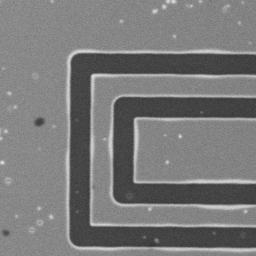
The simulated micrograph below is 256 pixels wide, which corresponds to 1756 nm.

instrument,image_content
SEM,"groups of lines, slits or small figures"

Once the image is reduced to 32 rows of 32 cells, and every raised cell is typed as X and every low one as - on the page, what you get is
XXXXXXXXXXXXXXXXXXXXXXXXXXXXXXXX
XXXXXXXXXXXXXXXXXXXXXXXXXXXXXXXX
XXXXXXXXXXXXXXXXXXXXXXXXXXXXXXXX
XXXXXXXXXXXXXXXXXXXXXXXXXXXXXXXX
XXXXXXXXXXXXXXXXXXXXXXXXXXXXXXXX
XXXXXXXXXXXXXXXXXXXXXXXXXXXXXXXX
XXXXXXXXXX-XXXXXXXXXXXXXXXXXXXXX
XXXXXXXXX-----------------------
XXXXXXXXX-----------------------
XXXXXXXXX---XXXXXXXXXXXXXX-XXXXX
XXXXXXXXX---XXXXXXXXXXXXXXXXXXXX
XXXXXXXXX---XXXXXXXXXXXXXXXXXXXX
XXXXXXXXX---XXX-----------------
XXXXXXXXX--XXX------------------
XXXXXXXXX--XXX------------------
XXXXXXXXX--XXX---XXXXXXXXXXXXXXX
XXXXXXXXX--XXX---XXXXXXXXXXXXXXX
XXXXXXXXX--XXX---XXXXXXXXXXXXXXX
XXXXXXXXX--XXX---XXXXXXXXXXXXXXX
XXXXXXXXX--XXX---XXXXXXXXXXXXXXX
XXXXXXXX---XXX---XXXXXXXXXXXXXXX
XXXXXXXXX--XXX---XXXXXXXXXXXXXXX
XXXXXXXXX--XXX---XXXXXXXXXXXXXXX
XXXXXXXXX--XXX------------------
XXXXXXXX---XXX------------------
XXXXXXXX---XXXX-----------------
XXXXXXXXX--XXXXXXXXXXXXXXXXXXXXX
XXXXXXXXX--XXXXXXXXXXXXXXXXXXXXX
XXXXXXXXX-----------------------
XXXXXXXXX-----------------------
XXXXXXXXX-----------------------
XXXXXXXXXXXXXXXXXXXXXXXXXXXXXXXX